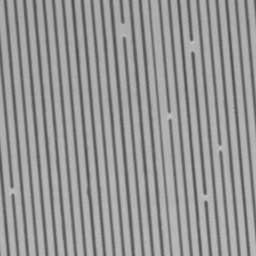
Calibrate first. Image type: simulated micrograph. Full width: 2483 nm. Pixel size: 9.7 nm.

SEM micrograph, parallel lines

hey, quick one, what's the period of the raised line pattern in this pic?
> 92.9 nanometers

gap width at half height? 29 nm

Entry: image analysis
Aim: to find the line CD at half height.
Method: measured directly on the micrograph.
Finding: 56.7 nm